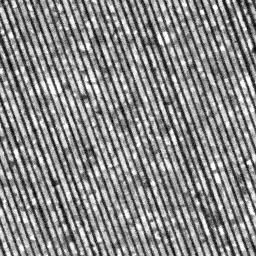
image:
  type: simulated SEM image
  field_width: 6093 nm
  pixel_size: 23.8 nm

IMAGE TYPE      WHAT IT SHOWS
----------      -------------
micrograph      parallel lines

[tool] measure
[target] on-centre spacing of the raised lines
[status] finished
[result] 165 nm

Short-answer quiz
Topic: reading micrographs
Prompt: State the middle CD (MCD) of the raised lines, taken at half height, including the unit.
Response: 3.65 px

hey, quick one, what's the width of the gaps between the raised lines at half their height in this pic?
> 86.8 nm